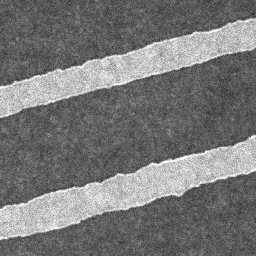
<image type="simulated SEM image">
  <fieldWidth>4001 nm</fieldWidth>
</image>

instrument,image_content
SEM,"one or a few lines or trenches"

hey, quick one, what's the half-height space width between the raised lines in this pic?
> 1.38 micrometres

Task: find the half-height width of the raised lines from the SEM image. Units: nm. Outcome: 460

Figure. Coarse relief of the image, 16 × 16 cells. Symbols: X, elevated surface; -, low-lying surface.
----------------
--------------XX
-----------XXXXX
-------XXXXXXX--
---XXXXXXX------
XXXXXX----------
XXX-------------
----------------
----------------
-------------XXX
---------XXXXXXX
------XXXXXXX---
--XXXXXXXX------
XXXXXX----------
XXX-------------
----------------